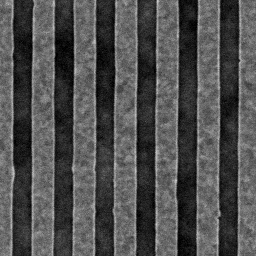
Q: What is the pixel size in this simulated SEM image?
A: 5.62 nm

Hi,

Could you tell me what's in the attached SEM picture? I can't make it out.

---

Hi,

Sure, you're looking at parallel lines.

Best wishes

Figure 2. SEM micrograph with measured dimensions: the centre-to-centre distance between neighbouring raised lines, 232 nm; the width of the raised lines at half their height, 120 nanometres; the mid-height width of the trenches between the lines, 114 nm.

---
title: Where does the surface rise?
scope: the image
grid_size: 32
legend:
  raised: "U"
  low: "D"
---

UUDDUUUDDUUUDDDUUDDDUUDDDUUDDDUU
UUDDUUUDDUUUDDDUUDDDUUDDDUUDDDUU
UDDDUUUDDUUUDDUUUDDDUUDDDUUDDDUU
UDDDUUUDDUUUDDUUUDDDUUDDDUUDDDUU
UUDDUUUDDUUUDDUUUDDDUUDDDUUDDDUU
UUDDUUUDDUUUDDUUUDDDUUDDDUUDDDUU
UUDDUUUDDUUUDDUUUDDDUUDDDUUDDDUU
UUDDUUUDDUUUDDDUUDDDUUDDDUUDDDUU
UUDDUUUDDUUUDDDUUDDDUUDDDUUDDDUU
UUDDUUUDDUUUDDDUUDDDUUDDDUUDDDUU
UUDDUUUDDUUUDDDUUDDDUUDDDUUDDDUU
UUDDUUUDDUUUDDUUUDDDUUDDDUUDDDUU
UUDDUUUDDUUUDDUUUDDDUUDDDUUDDDUU
UUDDUUUDDUUUDDUUUDDDUUDDDUUDDDUU
UUDDUUUDDUUUDDUUUDDDUUDDDUUDDDUU
UDDDUUUDDUUUDDUUUDDDUUDDDUUDDDUU
UDDDUUUDDUUUDDUUUDDDUUDDDUUDDDUU
UDDDUUUDDUUUDDUUUDDDUUDDDUUDDDUU
UDDDUUUDDUUUDDUUUDDDUUDDDUUDDDUU
UDDDUUUDDUUUDDUUUDDDUUDDDUUDDDUU
UUDDUUUDDUUUDDUUUDDDUUDDDUUDDDUU
UUDDUUUDDUUUDDUUUDDDUUDDDUUDDDUU
UUDDUUUDDUUUDDUUUDDDUUDDDUUDDDUU
UUDDUUUDDUUUDDUUUDDDUUDDDUUDDDUU
UDDDUUUDDUUUDDUUUDDDUUDDDUUDDDUU
UDDDUUUDDUUUDDUUUDDDUUDDDUUDDDUU
UDDDUUUDDUUUDDUUUDDDUUDDDUUDDDUU
UDDDUUUDDUUUDDUUUDDDUUDDDUUDDDUU
UDDDUUUDDUUUDDUUUDDDUUDDDUUDDDUU
UDDDUUUDDUUUDDUUUDDDUUDDDUUDDDUU
UDDDUUUDDUUUDDUUUDDDUUDDDUUDDDUU
UDDDUUUDDUUUDDUUUDDDUUDDDUUDDDUU